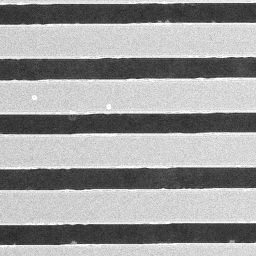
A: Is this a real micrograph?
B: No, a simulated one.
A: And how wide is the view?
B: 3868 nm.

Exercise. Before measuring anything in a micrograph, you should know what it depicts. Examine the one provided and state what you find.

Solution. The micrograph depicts lines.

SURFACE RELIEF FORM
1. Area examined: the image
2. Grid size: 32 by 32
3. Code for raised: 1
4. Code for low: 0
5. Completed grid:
11111110000000000000000000000000
00000000000000000000000000000000
00000000000000000000000000000000
11111111111111111111111111111111
11111111111111111111111111111111
11111111111111111111111111111111
11111111111111111111111111111111
00000000000000000000000000000000
00000000000000000000000000000000
00000000000000000000000000000000
11111111111111111111111111111111
11111111111111111111111111111111
11111111111111111111111111111111
11111111111111111111111111111111
00000000000000000000000000000000
00000000000000000000000000000000
00000000000000000000000000000000
11111111111111111111111111111111
11111111111111111111111111111111
11111111111111111111111111111111
11111111111111111111111111111111
00000000000000000000000000000000
00000000000000000000000000000000
00000000000000000000000000000000
11111111111111111111111111111111
11111111111111111111111111111111
11111111111111111111111111111111
11111111111111111111111111111111
00000000000000000000000000000000
00000000000000000000000000000000
00000000000000000011111111111111
11111111111111111111111111111111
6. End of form